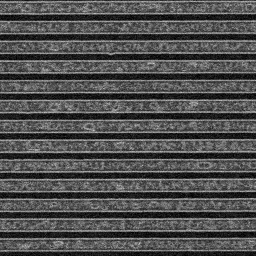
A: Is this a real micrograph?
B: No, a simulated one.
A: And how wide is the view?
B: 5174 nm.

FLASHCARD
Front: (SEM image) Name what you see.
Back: parallel lines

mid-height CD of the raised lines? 255 nanometers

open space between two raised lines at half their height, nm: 154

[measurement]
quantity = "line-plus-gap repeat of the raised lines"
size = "399 nm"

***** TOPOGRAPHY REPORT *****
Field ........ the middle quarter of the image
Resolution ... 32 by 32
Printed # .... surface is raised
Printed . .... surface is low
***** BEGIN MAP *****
################################
################################
................................
................................
################################
################################
################################
................................
................................
################################
################################
################################
................................
................................
################################
################################
################################
................................
................................
################################
################################
################################
................................
................................
################################
################################
################################
................................
................................
################################
################################
################################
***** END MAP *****